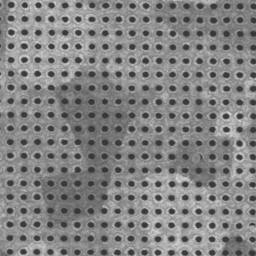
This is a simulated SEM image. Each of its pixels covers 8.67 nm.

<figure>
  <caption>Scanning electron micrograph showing a regular array of holes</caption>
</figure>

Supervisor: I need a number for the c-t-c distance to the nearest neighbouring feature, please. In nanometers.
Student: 115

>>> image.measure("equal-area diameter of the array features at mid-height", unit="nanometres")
56.2